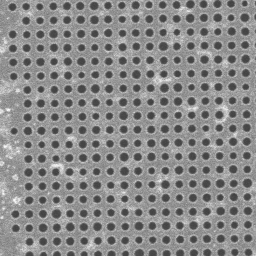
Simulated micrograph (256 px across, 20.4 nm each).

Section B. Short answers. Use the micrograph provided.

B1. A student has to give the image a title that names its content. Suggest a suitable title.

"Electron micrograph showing a regular array of holes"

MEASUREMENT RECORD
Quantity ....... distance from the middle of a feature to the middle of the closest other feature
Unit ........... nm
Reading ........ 272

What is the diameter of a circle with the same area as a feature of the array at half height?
159 nm